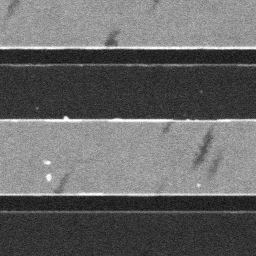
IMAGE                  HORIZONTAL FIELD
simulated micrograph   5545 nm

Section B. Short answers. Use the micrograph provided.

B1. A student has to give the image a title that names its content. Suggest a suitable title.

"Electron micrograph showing lines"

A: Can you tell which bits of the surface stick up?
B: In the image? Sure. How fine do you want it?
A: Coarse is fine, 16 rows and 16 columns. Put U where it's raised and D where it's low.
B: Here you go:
UUUUUUUUUUUUUUUU
UUUUUUUUUUUUUUUU
UUUUUUUUUUUUUUUU
DDDDDDDDDDDDDDDD
DDDDDDDDDDDDDDDD
DDDDDDDDDDDDDDDD
DDDDDDDDDDDDDDDD
DDDDDDDDDDDDDDDD
UUUUUUUUUUUUUUUU
UUUUUUUUUUUUUUUU
UUUUUUUUUUUUUUUU
UUUUUUUUUUUUUUUU
DDDDDDDDDDDDDDDD
DDDDDDDDDDDDDDDD
DDDDDDDDDDDDDDDD
DDDDDDDDDDDDDDDD